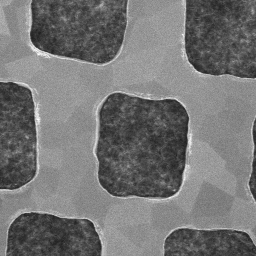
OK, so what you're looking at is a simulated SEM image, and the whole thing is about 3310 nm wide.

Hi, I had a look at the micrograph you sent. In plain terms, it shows holes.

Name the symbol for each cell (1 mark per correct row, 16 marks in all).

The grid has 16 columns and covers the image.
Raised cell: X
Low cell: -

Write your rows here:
XX------XXXX----
XX------XXXX----
XX------XXXX----
XXXX---XXXXX----
XXXXXXXXXXXXX---
--XXXXXXXXXXXXXX
--XXXX-----XXXXX
--XXXX------XXXX
--XXXX------XXXX
--XXXX------XXXX
--XXXX------XXXX
--XXXX-----XXXXX
XXXXXXXXXXXXXXXX
X---XXXXXXXXXXXX
X-----XXXXX----X
------XXXX------